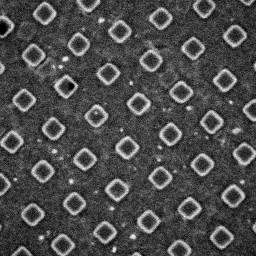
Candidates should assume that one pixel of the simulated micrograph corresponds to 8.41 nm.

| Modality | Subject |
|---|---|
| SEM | a regular array of raised bodies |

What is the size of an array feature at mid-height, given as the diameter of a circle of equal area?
0.163 µm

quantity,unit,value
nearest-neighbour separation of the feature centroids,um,0.359